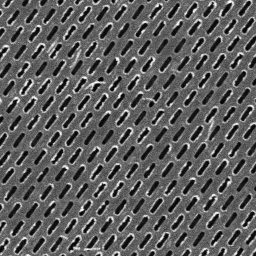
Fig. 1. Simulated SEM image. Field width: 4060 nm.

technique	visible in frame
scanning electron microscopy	a regular array of holes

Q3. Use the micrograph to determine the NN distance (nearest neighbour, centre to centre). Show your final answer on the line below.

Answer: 275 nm